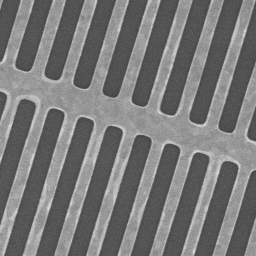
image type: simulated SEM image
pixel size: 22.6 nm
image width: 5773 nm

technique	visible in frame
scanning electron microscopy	groups of lines, slits or small figures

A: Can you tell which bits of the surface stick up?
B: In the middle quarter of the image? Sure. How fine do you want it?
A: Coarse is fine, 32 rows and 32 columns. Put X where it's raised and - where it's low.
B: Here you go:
XXX-----XXX-----XXX-----XXX-----
XXX-----XXX-----XXX-----XXX-----
XX------XXX----XXX-----XXX-----X
XX-----XXX-----XXX-----XXX-----X
XX-----XXX-----XXX-----XXX-----X
XXX---XXXX-----XXX-----XX-----XX
XXXXXXXXX-----XXX-----XXX-----XX
XXXXXXXXXX----XXX-----XXX-----XX
XXXXXXXXXXXX-XXXX----XXX------XX
XXXXXXXXXXXXXXXXX----XXX------XX
XXXXXXXXXXXXXXXXXX---XXX-----XXX
XXXXXXXXXXXXXXXXXXXXXXXX-----XXX
XXXXXXXXXXXXXXXXXXXXXXXXX---XXX-
XXXX--XXXXXXXXXXXXXXXXXXXXXXXXX-
XXX-----XXXXXXXXXXXXXXXXXXXXXXXX
XXX-----XXX--XXXXXXXXXXXXXXXXXXX
XX------XX-----XXXXXXXXXXXXXXXXX
XX-----XXX-----XXXXXXXXXXXXXXXXX
XX-----XX------XXX---XXXXXXXXXXX
X------XX-----XXX-----XXXXXXXXXX
X-----XXX-----XXX-----XXX---XXXX
X-----XX------XXX----XXXX----XXX
------XX------XX-----XXX-----XXX
-----XXX-----XXX-----XXX-----XXX
-----XXX-----XXX-----XXX----XXXX
-----XX------XX-----XXX-----XXX-
----XXX-----XXX-----XXX-----XXX-
----XXX-----XX------XXX-----XXX-
----XXX-----XX------XX-----XXX--
---XXX-----XXX-----XXX-----XXX--
---XXX-----XX------XXX-----XXX--
---XXX-----XX------XX-----XXXX--